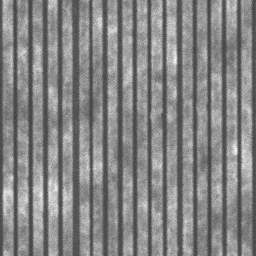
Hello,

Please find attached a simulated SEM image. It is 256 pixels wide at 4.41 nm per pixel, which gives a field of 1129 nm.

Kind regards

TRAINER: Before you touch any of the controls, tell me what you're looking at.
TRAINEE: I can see parallel lines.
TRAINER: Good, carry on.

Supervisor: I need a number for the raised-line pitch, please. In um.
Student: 0.0658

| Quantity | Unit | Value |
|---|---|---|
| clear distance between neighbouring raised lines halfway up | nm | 20.4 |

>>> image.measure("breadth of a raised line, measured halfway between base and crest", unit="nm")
44.7